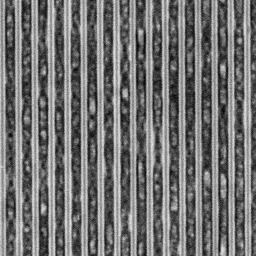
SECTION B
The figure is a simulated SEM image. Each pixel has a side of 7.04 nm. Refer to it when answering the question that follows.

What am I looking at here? parallel lines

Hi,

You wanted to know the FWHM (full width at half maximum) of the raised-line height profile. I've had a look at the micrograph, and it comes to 0.0334 um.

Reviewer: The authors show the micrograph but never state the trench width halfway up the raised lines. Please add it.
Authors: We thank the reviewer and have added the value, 79.2 nm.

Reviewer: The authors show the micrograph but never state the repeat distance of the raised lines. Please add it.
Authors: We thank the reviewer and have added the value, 115 nanometers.